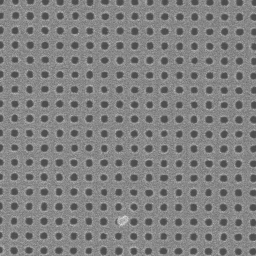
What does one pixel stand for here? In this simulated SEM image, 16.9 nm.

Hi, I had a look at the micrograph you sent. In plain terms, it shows a regular array of holes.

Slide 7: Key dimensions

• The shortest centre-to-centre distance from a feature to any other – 244 nanometers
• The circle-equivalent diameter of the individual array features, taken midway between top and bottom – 131 nm